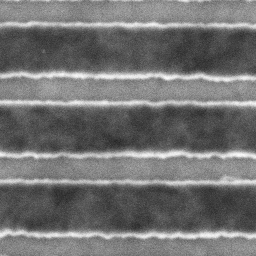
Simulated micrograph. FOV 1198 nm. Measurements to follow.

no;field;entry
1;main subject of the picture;lines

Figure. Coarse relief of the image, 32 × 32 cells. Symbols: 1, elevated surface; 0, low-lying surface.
00000000000000000000000000000000
00000000000000000000000000000000
00000000000000000000000000000000
11111111111111111111111111111111
11111111111111111111111111111111
11111111111111111111111111111111
11111111111111111111111111111111
11111111111111111111111111111111
11111111111111111111111111111111
11011111111111111111111111111111
00000000000000000000000000000000
00000000000000000000000000000000
00000000000000000000000000000000
11111111111111111111111111111111
11111111111111111111111111111111
11111111111111111111111111111111
11111111111111111111111111111111
11111111111111111111111111111111
11111111111111111111111111111111
11101110111111100111100111011111
00000000000000000000000000000000
00000000000000000000000000000000
00100100000000000000000000000000
11111111111111111111111111111111
11111111111111111111111111111111
11111111111111111111111111111111
11111111111111111111111111111111
11111111111111111111111111111111
11111111111111111111111111111111
00001111011001111111111111101111
00000000000000000000000000000000
00000000000000000000000000000000